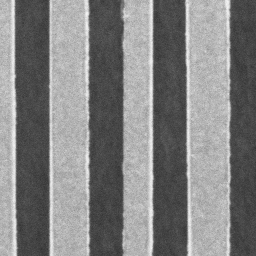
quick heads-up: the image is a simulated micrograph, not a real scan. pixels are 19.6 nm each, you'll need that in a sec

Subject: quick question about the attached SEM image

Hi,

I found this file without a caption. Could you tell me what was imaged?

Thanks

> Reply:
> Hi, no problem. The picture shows lines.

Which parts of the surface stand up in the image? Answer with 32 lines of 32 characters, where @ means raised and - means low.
@@----@@@@@-----@@@----@@@@@----
@@----@@@@@-----@@@----@@@@@----
@@----@@@@@-----@@@----@@@@@----
@@----@@@@@-----@@@----@@@@@----
@@----@@@@@-----@@@----@@@@@@---
@@----@@@@@-----@@@----@@@@@@---
@@----@@@@@-----@@@----@@@@@@---
@@----@@@@@-----@@@----@@@@@----
@@----@@@@@-----@@@----@@@@@----
@@----@@@@@-----@@@----@@@@@@---
@@----@@@@@-----@@@----@@@@@@---
@@----@@@@@-----@@@----@@@@@@---
@@----@@@@@-----@@@----@@@@@@---
@@----@@@@@-----@@@----@@@@@@---
@@----@@@@@-----@@@----@@@@@@---
@@----@@@@@-----@@@----@@@@@@---
@@----@@@@@-----@@@----@@@@@----
@@----@@@@@-----@@@----@@@@@----
@@----@@@@@-----@@@----@@@@@@---
@@----@@@@@-----@@@-----@@@@@---
@@----@@@@@-----@@@-----@@@@@---
@@----@@@@@-----@@@-----@@@@@---
@@----@@@@@-----@@@-----@@@@@---
@@----@@@@@-----@@@-----@@@@@---
@@----@@@@@-----@@@-----@@@@@---
@@----@@@@@-----@@@-----@@@@@---
@@----@@@@@----@@@@-----@@@@@---
@@----@@@@@-----@@@-----@@@@@---
@@----@@@@@----@@@@-----@@@@@---
@@----@@@@@----@@@@-----@@@@----
@@----@@@@@----@@@@-----@@@@----
@@----@@@@@----@@@@-----@@@@----